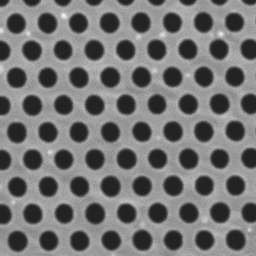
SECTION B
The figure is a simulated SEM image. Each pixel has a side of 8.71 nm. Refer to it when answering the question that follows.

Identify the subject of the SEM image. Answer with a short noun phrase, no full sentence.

a regular array of holes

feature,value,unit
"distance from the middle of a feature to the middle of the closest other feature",0.27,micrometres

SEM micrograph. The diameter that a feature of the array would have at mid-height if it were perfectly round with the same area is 0.177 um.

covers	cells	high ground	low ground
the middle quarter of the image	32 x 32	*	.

********************************
**...*****...*****...****....***
*.....***.....***.....***.....**
*.....***.....***.....***.....**
**....***.....***.....***....***
**...*****...*****...*****...***
********************************
***************.****************
..****...*****...****....****...
..***.....***.....***.....***...
..***.....***.....***.....**....
..****....***.....***....****...
.*****...*****...*****..*******.
********************************
***.*******.******..******..****
**....***....****....****....***
*.....***.....***.....***.....**
*.....***.....***.....***.....**
**....****....****....***....***
***.*******.*******.*******.****
********************************
.******..*****...*****...****...
..***.....***.....***.....***...
..***.....***.....***.....***...
..***.....***.....***.....***...
..****....****....****...****...
.*******************************
********************************
**...*****...*****...*****...***
**....***.....***.....***.....**
*.....***.....***.....***.....**
**....***.....***.....***.....**